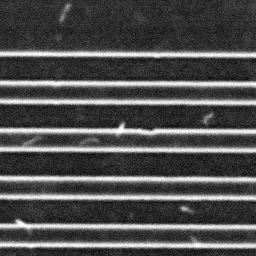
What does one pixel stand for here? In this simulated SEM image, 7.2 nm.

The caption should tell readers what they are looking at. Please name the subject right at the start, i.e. parallel lines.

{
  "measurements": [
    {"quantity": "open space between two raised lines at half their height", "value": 194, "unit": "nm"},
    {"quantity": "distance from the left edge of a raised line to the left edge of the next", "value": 343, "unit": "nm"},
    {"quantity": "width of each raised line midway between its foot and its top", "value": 149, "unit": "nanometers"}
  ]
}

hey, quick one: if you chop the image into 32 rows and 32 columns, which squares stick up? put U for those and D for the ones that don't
UUUUUUUUUUUUUUUUUUUUUUUUUUUUUUUU
UUUUUUUUUUUUUUUUUUUUUUUUUUUUUUUU
UUUUUUUUUUUUUUUUUUUUUUUUUUUUUUUU
UUUUUUUUUUUUUUUUUUUUUUUUUUUUUUUU
UUUUUUUUUUUUUUUUUUUUUUUUUUUUUUUU
UUUUUUUUUUUUUUUUUUUUUUUUUUUUUUUU
UUUUUUUUUUUUUUUUUUUUUUUUUUUUUUUU
DDDDDDDDDDDDDDDDDDDDDDDDDDDDDDDD
DDDDDDDDDDDDDDDDDDDDDDDDDDDDDDDD
DDDDDDDDDDDDDDDDDDDDDDDDDDDDDDDD
UUUUUUUUUUUUUUUUUUUUUUUUUUUUUUUU
UUUUUUUUUUUUUUUUUUUUUUUUUUUUUUUU
UUUUUUUUUUUUUUUUUUUUUUUUUUUUUUUU
DDDDDDDDDDDDDDDDDDDDDDDDDDDDDDDD
DDDDDDDDDDDDDDDDDDDDDDDDDDDDDDDD
DDDDDDDDDDDDDDDDDDDDDDDDDDDDDDDD
UUUUUUUUUUUUUUUUUUUUUUUUUUUUUUUU
UUUUUUUUUUUUUUUUUUUUUUUUUUUUUUUU
UUUUUUUUUUUUUUUUUUUUUUUUUUUUUUUU
DDDDDDDDDDDDDDDDDDDDDDDDDDDDDDDD
DDDDDDDDDDDDDDDDDDDDDDDDDDDDDDDD
DDDDDDDDDDDDDDDDDDDDDDDDDDDDDDDD
UUUUUUUUUUUUUUUUUUUUUUUUUUUUUUUU
UUUUUUUUUUUUUUUUUUUUUUUUUUUUUUUU
UUUUUUUUUUUUUUUUUUUUUUUUUUUUUUUU
DDDDDDDDDDDDDDDDDDDDDDDDDDDDDDDD
DDDDDDDDDDDDDDDDDDDDDDDDDDDDDDDD
DDDDDDDDDDDDDDDDDDDDDDDDDDDDDDDD
UUUUUUUUUUUUUUUUUUUUUUUUUUUUUUUU
UUUUUUUUUUUUUUUUUUUUUUUUUUUUUUUU
UUUUUUUUUUUUUUUUUUUUUUUUUUUUUUUU
DDDDDDDDDDDDDDDDDDDDDDDDDDDDDDDD